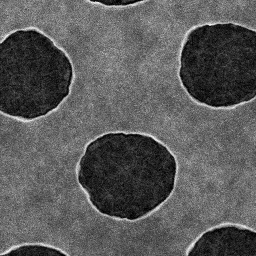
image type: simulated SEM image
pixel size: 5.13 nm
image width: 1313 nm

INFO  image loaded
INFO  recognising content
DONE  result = holes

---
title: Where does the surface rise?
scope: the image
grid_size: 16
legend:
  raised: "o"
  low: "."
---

oooooooooooooooo
oooooooooooooooo
...ooooooooo....
....ooooooo.....
.....oooooo.....
....oooooooo....
....ooooooooo..o
oooooooooooooooo
oooooo...ooooooo
ooooo......ooooo
ooooo......ooooo
ooooo......ooooo
oooooo....oooooo
ooooooo..ooooooo
ooooooooooooo...
o..ooooooooo....